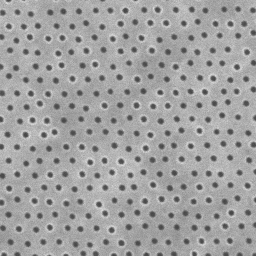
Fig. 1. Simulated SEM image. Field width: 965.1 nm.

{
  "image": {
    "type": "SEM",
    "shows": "a regular array of holes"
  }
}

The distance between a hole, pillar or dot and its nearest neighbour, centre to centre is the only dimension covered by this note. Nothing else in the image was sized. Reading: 0.0518 micrometres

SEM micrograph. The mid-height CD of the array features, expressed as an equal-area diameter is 23.7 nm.